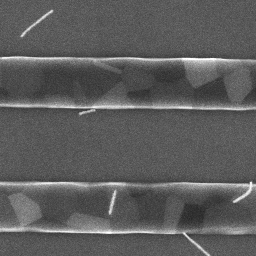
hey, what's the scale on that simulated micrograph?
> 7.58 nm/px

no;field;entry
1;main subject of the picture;wiring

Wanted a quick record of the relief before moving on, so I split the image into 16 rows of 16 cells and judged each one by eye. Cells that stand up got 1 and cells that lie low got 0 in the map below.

0000000000000000
0000000000000000
0000000000000000
0000000000000000
1111111111111111
1111111111111111
1111111111111111
0000000000000000
0000000000000000
0000000000000000
0000000000000000
1111101100010000
1111111111111111
1111111111111111
0000011101110010
0000000000000000